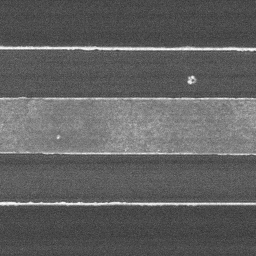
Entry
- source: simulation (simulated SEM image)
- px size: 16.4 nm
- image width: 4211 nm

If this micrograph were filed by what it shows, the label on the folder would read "lines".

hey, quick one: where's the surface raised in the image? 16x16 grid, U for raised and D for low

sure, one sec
UUUUUUUUUUUUUUUU
UUUUUUUUUUUUUUUU
UUUUUUUUUUUUUUUU
DDDDDDDDDDDDDDDD
DDDDDDDDDDDDDDDD
DDDDDDDDDDDDDDDD
UUUUUUUUUUUUUUUU
UUUUUUUUUUUUUUUU
UUUUUUUUUUUUUUUU
UUUUUUUUUUUUUUUU
DDDDDDDDDDDDDDDD
DDDDDDDDDDDDDDDD
DDDDDDDDDDDDDDDD
UUUUUUUUUUUUUUUU
UUUUUUUUUUUUUUUU
UUUUUUUUUUUUUUUU